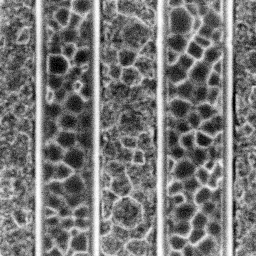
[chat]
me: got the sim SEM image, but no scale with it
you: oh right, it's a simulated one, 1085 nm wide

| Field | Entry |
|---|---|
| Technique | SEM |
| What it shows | one or a few lines or trenches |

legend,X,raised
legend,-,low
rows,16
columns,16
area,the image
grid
--XXXX----XXXX--
--XXXX----XXXX--
--XXXX----XXXX--
--XXXX----XXXX--
--XXXX----XXXX--
--XXXX----XXXX--
--XXXX----XXXX--
--XXXX----XXXX--
--XXXX----XXXX--
--XXXX----XXXX--
--XXXX----XXXX--
--XXXX----XXXX--
--XXXX----XXXX--
--XXXX----XXXX--
--XXXX----XXXX--
--XXXX----XXXX--